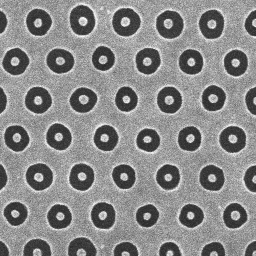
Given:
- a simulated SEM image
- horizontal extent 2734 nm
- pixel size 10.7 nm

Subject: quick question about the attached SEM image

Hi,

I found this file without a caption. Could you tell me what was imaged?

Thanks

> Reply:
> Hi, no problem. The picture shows a regular array of ring-shaped grooves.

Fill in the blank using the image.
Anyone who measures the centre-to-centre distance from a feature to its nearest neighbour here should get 456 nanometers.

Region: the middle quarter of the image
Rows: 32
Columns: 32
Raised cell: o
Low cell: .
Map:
..ooooo.....oooooo......ooooo...
..ooooooo..ooooooo.....oooooo...
oooooooooooooooooooo..ooooooooo.
oooooooooooooooooooooooooooooooo
oooooooooooooooooooooooooooooooo
ooooooooooooooo.oooooooooooooooo
ooo....oooooo....ooooooo.....ooo
oo......ooooo.....oooooo.....ooo
o...oo..ooooo..o..ooooo..oo...oo
o...oo..ooooo..o..ooooo..oo...oo
oo.....oooooo.....ooooo......ooo
ooo....ooooooo...ooooooo.....ooo
oooooooooooooooooooooooooooooooo
oooooooooooooooooooooooooooooooo
oooooooooooooooooooooooooooooooo
oooooooooo..oooooooooooooooooooo
.ooooooo.....ooooooo..ooooooo...
..oooooo.....ooooo......ooooo...
..ooooo..oo...oooo..oo..oooo...o
..ooooo......ooooo..oo..oooo...o
.ooooooo.....ooooo......ooooo...
ooooooooo...oooooooo...ooooooo..
oooooooooooooooooooooooooooooooo
oooooooooooooooooooooooooooooooo
oooooooooooooooooooooooooooooooo
oo....ooooooo...ooooooooo...oooo
oo.....ooooo.....ooooooo.....ooo
o...o...oooo...o..ooooo......ooo
o...o...oooo..oo..ooooo..oo..ooo
o......oooooo.....ooooo......ooo
oo.....oooooo....ooooooo....oooo
ooo...ooooooooooooooooooo.oooooo